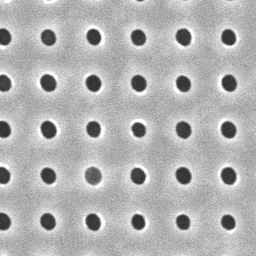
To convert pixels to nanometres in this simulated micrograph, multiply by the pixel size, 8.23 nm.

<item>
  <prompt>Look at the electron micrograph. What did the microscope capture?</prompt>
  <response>a regular array of holes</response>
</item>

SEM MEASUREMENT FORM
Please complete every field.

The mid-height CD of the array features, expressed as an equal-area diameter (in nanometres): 142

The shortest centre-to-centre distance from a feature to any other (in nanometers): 370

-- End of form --